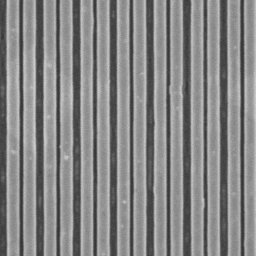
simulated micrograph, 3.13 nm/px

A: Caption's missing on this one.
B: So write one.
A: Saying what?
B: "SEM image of parallel lines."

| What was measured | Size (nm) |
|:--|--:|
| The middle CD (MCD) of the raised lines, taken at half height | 34.5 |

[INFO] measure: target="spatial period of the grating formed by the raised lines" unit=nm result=57.7